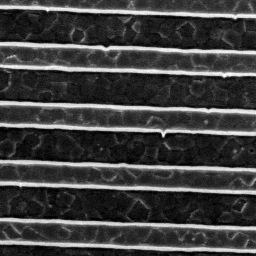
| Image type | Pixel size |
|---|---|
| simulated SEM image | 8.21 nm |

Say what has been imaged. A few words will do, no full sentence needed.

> parallel lines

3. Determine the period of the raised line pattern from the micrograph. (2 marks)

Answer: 481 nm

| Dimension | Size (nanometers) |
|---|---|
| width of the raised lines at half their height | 194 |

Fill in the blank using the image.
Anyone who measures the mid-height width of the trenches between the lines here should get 287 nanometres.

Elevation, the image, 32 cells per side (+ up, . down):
++++++++++++++++++++++++++++++++
...............+++++++++++++++++
................................
................................
................................
++..............................
++++++++++++++++++++++++++++++..
++++++++++++++++++++++++++++++++
.......+++++++++++++++++++++++++
................................
................................
................................
................................
++++++++++++++++++..............
++++++++++++++++++++++++++++++++
++++++++++++++++++++++++++++++++
....................+....+++++++
................................
................................
................................
++++++++........................
++++++++++++++++++++++++++++++++
++++++++++++++++++++++++++++++++
.............++.++++++++++++++++
................................
................................
................................
++..............................
+++++++++++++++++++++++++++++++.
++++++++++++++++++++++++++++++++
...+++++++++++++++++++++++++++++
................................